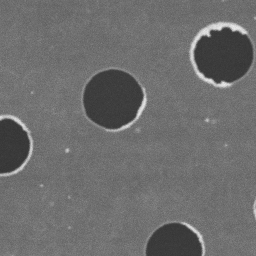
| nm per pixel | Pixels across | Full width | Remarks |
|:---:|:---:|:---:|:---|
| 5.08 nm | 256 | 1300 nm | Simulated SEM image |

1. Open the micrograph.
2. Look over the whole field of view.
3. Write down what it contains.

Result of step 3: holes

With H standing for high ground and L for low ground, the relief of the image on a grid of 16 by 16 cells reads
HHHHHHHHHHHHHHHH
HHHHHHHHHHHHHHHH
HHHHHHHHHHHHHLLL
HHHHHHHHHHHHLLLL
HHHHHHLLHHHHHLLH
HHHHHLLLLHHHHHHH
HHHHHLLLLHHHHHHH
LHHHHHLLHHHHHHHH
LLHHHHHHHHHHHHHH
LLHHHHHHHHHHHHHH
LHHHHHHHHHHHHHHH
HHHHHHHHHHHHHHHH
HHHHHHHHHHHHHHHH
HHHHHHHHHHHHHHHH
HHHHHHHHHHLLHHHH
HHHHHHHHHLLLLHHH